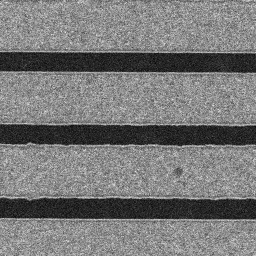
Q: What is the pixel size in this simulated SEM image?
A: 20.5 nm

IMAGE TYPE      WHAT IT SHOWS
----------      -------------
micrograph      one or a few lines or trenches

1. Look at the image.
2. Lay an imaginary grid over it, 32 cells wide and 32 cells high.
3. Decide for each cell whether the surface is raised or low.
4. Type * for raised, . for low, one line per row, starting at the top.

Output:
********************************
********************************
********************************
********************************
********************************
********************************
...........................*****
................................
................................
********************************
********************************
********************************
********************************
********************************
********************************
......**.........*......********
................................
................................
********************************
********************************
********************************
********************************
********************************
********************************
********************************
................................
................................
***********.....................
********************************
********************************
********************************
********************************